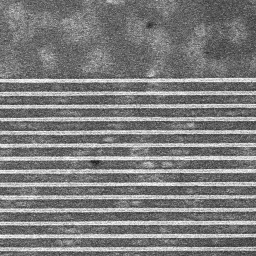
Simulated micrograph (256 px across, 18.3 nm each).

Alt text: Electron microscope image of parallel lines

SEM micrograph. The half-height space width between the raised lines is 187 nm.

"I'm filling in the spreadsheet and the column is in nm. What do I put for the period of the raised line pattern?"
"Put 237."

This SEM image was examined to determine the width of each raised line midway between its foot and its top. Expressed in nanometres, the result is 52.5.